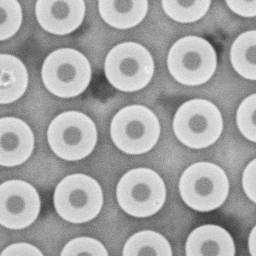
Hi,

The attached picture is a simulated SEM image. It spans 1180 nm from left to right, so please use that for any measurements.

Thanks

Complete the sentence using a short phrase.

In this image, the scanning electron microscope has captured an array of small figures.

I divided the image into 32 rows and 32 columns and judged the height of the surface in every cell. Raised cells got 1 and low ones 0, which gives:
11000111111011111100111111001111
11100111111001111100011111000111
11100111110001111100001100000000
11000111110000010000000000000000
10000000000000000000000000000011
00000000000000011000001111000111
00000001110000111110011111100111
11000011111001111110011111100111
11100111111001111110011111100111
11100111111001111110001111000011
11100011111000111100000110000000
11100011110000000000000000000000
11000000000000000000000010000001
00000000000000001100001111100011
00000001111000111110001111110011
11100011111100111111001111110011
11110011111100111111001111110011
11110011111100111111000111100001
11110011111100011110000000000000
11110001111000000000000000000000
11000000000000000000000011100001
00000000000000001110000111110001
00000000111100011111000111110011
11110001111110011111101111111011
11111001111110011111100111110001
11111001111110011111000111110000
11111001111100001110000000000000
11110000111000000000000000000000
01100000000000000000000001110000
00000000000000000111000011111001
00100000111110001111100111111001
11111000111110011111100111111001